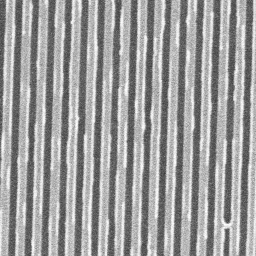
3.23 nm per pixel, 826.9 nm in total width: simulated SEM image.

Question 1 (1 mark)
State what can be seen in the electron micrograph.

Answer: parallel lines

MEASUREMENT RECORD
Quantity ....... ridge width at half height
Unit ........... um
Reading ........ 0.0303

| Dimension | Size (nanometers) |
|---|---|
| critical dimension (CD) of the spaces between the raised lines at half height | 24.2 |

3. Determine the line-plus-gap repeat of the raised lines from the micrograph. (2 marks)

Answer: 53.3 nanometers